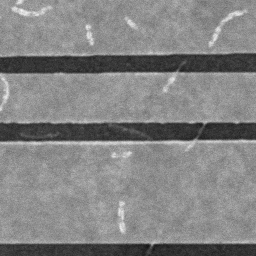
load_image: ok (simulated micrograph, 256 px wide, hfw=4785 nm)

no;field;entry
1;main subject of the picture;lines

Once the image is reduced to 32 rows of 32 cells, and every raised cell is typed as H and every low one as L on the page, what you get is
HHHHHHHHHHHHHHHHHHHHHHHHHHHHHHHH
HHHHHHHHHHHHHHHHHHHHHHHHHHHHHHHH
HHHHHHHHHHHHHHHHHHHHHHHHHHHHHHHH
HHHHHHHHHHHHHHHHHHHHHHHHHHHHHHHH
HHHHHHHHHHHHHHHHHHHHHHHHHHHHHHHH
HHHHHHHHHHHHHHHHHHHHHHHHHHHHHHHH
HHHHHHHHHHHHHHHHHHHHHHHHHHHHHHHH
LLLLLLLLLLLLLLLLLLLLLLLLLLLLLLLL
LLLLLLLLLLLLLLLLLLLLLLLLLLLLLLLL
HHHHHHHHHHHHHHHHHHHHHHHHHHHHHHHH
HHHHHHHHHHHHHHHHHHHHHHHHHHHHHHHH
HHHHHHHHHHHHHHHHHHHHHHHHHHHHHHHH
HHHHHHHHHHHHHHHHHHHHHHHHHHHHHHHH
HHHHHHHHHHHHHHHHHHHHHHHHHHHHHHHH
HHHHHHHHHHHHHHHHHHHHHHHHHHHHHHHH
LLLLLLLLLLLLLLLLLLLLLLLLLLLLLLLL
LLLLLLLLLLLLLLLLLLLLLLLLLLLLLLLL
LLLLLLLLLLLLLLLLLLLLLLLLHLLLLLHL
HHHHHHHHHHHHHHHHHHHHHHHHHHHHHHHH
HHHHHHHHHHHHHHHHHHHHHHHHHHHHHHHH
HHHHHHHHHHHHHHHHHHHHHHHHHHHHHHHH
HHHHHHHHHHHHHHHHHHHHHHHHHHHHHHHH
HHHHHHHHHHHHHHHHHHHHHHHHHHHHHHHH
HHHHHHHHHHHHHHHHHHHHHHHHHHHHHHHH
HHHHHHHHHHHHHHHHHHHHHHHHHHHHHHHH
HHHHHHHHHHHHHHHHHHHHHHHHHHHHHHHH
HHHHHHHHHHHHHHHHHHHHHHHHHHHHHHHH
HHHHHHHHHHHHHHHHHHHHHHHHHHHHHHHH
HHHHHHHHHHHHHHHHHHHHHHHHHHHHHHHH
HHHHHHHHHHHHHHHHHHHHHHHHHHHHHHHH
LLLLLLLLLLLLLLLLLLLLLLLLLLLLLLLL
LLLLLLLLLLLLLLLLLLLLLLLLLLLLLLLL